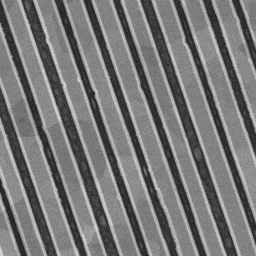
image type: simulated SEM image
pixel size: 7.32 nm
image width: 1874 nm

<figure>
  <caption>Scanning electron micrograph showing parallel lines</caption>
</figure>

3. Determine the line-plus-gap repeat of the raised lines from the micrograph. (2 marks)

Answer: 208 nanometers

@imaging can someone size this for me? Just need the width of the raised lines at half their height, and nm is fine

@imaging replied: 124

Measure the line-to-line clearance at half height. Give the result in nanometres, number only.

80.6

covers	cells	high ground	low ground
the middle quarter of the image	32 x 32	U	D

UUUDDUUUUUDDDUUUUDDDUUUUDDDDUUUU
UUUDDDUUUUDDDUUUUUDDUUUUUDDDUUUU
UUUUDDUUUUUDDUUUUUDDDUUUUDDDDUUU
UUUUDDUUUUUDDDUUUUDDDUUUUDDDDUUU
UUUUDDDUUUUDDDUUUUUDDUUUUUDDDUUU
UUUUUDDUUUUUDDDUUUUDDDUUUUDDDDUU
UUUUUDDDUUUUDDDUUUUDDDUUUUDDDDUU
DUUUUDDDUUUUDDDUUUUUDDUUUUUDDDUU
DUUUUUDDUUUUUDDDUUUUDDDUUUUDDDDU
DUUUUUDDUUUUUDDDUUUUDDDUUUUDDDDU
DDUUUUDDDUUUUDDDUUUUUDDUUUUUDDDU
DDUUUUUDDUUUUUDDDUUUUDDDUUUUDDDD
DDUUUUUDDUUUUUDDDUUUUDDDUUUUDDDD
DDDUUUUDDDUUUUDDDUUUUUDDUUUUUDDD
DDDUUUUUDDUUUUUDDDUUUUDDDUUUUDDD
DDDUUUUUDDDUUUUDDDUUUUDDDUUUUDDD
DDDDUUUUDDDUUUUDDDUUUUUDDDUUUUDD
DDDDUUUUUDDUUUUUDDUUUUUDDDUUUUDD
UDDDUUUUUDDDUUUUDDDUUUUDDDUUUUDD
UDDDDUUUUDDDUUUUUDDUUUUUDDDUUUUD
UDDDDUUUUUDDUUUUUDDDUUUUDDDUUUUD
UDDDDUUUUUDDDUUUUDDDUUUUDDDUUUUD
UUDDDDUUUUDDDUUUUUDDUUUUUDDDUUUU
UUDDDDUUUUUDDUUUUUDDDUUUUDDDUUUU
UUUDDDUUUUUDDDUUUUDDDUUUUDDDUUUU
UUUDDDDUUUUDDDUUUUUDDUUUUUDDDUUU
UUUDDDDUUUUUDDUUUUUDDDUUUUDDDUUU
UUUUDDDUUUUUDDDUUUUDDDUUUUDDDUUU
UUUUDDDDUUUUDDDUUUUDDDUUUUUDDDUU
UUUUDDDDUUUUUDDUUUUUDDDUUUUDDDUU
UUUUDDDDUUUUUDDDUUUUDDDUUUUDDDUU
DUUUUDDDDUUUUDDDUUUUDDDDUUUUDDDU